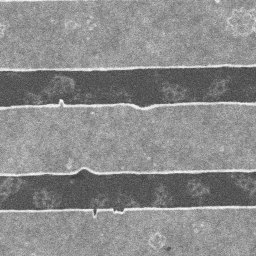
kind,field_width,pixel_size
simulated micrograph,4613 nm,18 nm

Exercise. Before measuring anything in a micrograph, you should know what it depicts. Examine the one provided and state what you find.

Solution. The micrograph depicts one or a few lines or trenches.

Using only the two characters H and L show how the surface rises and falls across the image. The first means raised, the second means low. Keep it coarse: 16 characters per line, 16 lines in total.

HHHHHHHHHHHHHHHH
HHHHHHHHHHHHHHHH
HHHHHHHHHHHHHHHH
HHHHHHHHHHHHHHHH
LLLLLLLLLLLLLLLL
LLLLLLLLLLLLLLLL
LLLLLLLLLLLHHHHH
HHHHHHHHHHHHHHHH
HHHHHHHHHHHHHHHH
HHHHHHHHHHHHHHHH
HHHHHHHHHHHHHHHH
LLLLLLLLLLLLLLLL
LLLLLLLLLLLLLLLL
HHHHHHHHHHHHHHHH
HHHHHHHHHHHHHHHH
HHHHHHHHHHHHHHHH